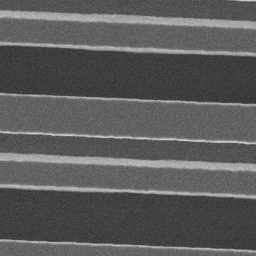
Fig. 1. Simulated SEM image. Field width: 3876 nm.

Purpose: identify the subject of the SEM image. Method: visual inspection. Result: lines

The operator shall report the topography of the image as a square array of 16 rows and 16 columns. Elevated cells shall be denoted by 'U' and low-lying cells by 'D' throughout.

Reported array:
UUUUUUUUUUUUUUUU
UUUUUUUUUUUUUUUU
UUUUUUUUUUUUUUUU
DDDDDDDDDDDDDDDD
DDDDDDDDDDDDDDDD
DDDDDDDDDDDDDDDD
UUUUUUUUUUUUUUDD
UUUUUUUUUUUUUUUU
UUUUUUUUUUUUUUUU
UUUUUUUUUUUUUUUU
UUUUUUUUUUUUUUUU
UUUUUUUUUUUUUUUU
DDDDDDDDDDDDDDDD
DDDDDDDDDDDDDDDD
DDDDDDDDDDDDDDDD
UUUUUUUUUUUUDDDD